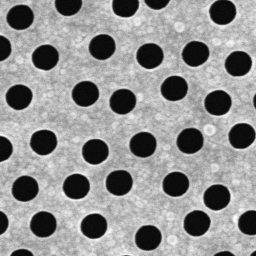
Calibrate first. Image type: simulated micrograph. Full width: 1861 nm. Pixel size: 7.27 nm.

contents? a regular array of holes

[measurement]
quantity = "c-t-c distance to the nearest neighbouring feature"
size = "305 nm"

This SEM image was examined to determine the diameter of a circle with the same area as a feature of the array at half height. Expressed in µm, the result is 0.194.